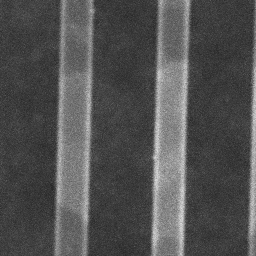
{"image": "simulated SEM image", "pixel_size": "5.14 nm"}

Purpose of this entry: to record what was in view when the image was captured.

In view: one or a few lines or trenches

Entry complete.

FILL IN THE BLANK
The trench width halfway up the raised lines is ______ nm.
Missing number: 341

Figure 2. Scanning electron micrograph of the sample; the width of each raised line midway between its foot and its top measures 156 nm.